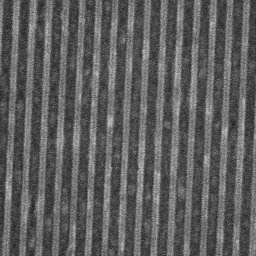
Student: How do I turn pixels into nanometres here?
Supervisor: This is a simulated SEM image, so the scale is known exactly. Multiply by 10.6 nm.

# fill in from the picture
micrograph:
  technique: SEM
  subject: parallel lines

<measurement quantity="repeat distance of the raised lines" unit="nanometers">174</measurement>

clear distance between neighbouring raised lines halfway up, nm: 122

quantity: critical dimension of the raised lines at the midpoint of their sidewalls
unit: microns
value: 0.0517